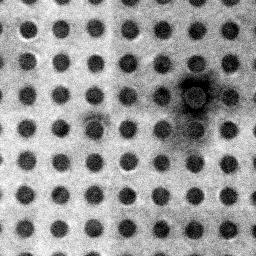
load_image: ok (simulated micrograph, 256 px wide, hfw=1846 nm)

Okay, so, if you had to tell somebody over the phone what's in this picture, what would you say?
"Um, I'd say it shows a regular array of raised bodies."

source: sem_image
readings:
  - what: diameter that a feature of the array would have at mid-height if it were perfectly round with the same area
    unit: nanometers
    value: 144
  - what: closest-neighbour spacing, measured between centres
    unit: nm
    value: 234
